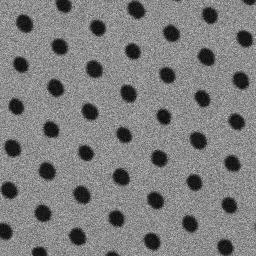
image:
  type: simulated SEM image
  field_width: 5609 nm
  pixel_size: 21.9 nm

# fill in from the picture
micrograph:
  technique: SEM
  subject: a regular array of holes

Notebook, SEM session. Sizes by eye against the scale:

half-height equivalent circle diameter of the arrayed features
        365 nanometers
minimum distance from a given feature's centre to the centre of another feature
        0.912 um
